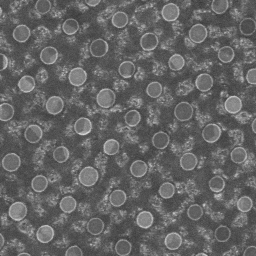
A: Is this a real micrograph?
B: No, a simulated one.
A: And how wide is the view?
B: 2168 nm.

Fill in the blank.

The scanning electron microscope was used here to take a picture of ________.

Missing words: a regular array of raised bodies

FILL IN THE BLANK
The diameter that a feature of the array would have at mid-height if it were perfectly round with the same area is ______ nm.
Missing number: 140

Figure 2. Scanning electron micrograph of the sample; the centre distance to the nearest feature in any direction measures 296 nm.